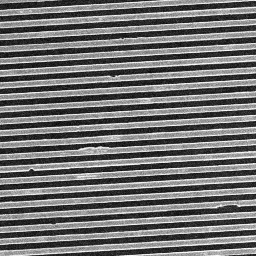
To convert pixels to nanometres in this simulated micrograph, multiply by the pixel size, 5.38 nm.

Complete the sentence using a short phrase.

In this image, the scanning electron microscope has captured parallel lines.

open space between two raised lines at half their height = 6.25 pixels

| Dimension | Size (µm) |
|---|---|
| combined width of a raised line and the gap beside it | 0.0646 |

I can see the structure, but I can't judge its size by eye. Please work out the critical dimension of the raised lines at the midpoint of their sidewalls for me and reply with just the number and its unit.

28.9 nm